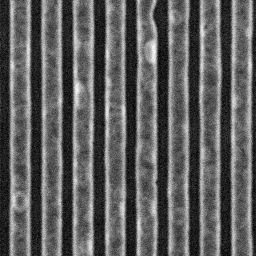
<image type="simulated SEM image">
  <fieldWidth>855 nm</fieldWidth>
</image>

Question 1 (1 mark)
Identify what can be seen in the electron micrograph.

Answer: parallel lines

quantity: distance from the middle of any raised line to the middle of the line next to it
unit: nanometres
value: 106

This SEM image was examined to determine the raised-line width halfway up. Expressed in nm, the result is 62.5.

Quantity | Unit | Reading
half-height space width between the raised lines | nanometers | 42.5